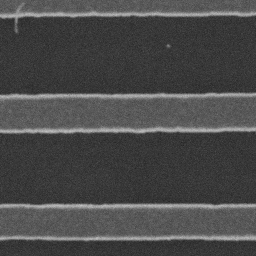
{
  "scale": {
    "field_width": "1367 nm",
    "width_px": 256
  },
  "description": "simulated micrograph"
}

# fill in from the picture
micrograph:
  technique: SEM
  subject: lines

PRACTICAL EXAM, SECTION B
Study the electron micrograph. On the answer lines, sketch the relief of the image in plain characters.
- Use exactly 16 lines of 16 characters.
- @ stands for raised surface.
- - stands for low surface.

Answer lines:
@@@@@@@@@@@@@@@@
----------------
----------------
----------------
----------------
----------------
@@@@@@@@@@@@@@@@
@@@@@@@@@@@@@@@@
----------------
----------------
----------------
----------------
----------------
@@@@@@@@@@@@@@@@
@@@@@@@@@@@@@@@@
----------------